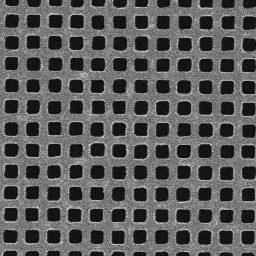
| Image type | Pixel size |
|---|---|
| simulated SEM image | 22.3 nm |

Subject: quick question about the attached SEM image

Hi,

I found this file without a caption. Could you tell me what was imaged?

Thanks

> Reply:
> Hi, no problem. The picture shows a regular array of holes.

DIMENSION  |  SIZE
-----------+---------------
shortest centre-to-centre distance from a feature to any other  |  0.47 um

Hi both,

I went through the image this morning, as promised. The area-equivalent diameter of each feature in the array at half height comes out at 332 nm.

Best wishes